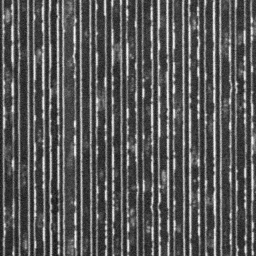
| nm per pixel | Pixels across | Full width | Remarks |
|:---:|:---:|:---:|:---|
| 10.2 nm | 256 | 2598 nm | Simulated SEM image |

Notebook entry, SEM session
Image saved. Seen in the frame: parallel lines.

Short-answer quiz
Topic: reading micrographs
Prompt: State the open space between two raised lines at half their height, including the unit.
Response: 90.1 nm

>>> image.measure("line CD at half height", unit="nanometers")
69.8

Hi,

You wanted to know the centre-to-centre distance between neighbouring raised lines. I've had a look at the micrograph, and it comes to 0.157 microns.